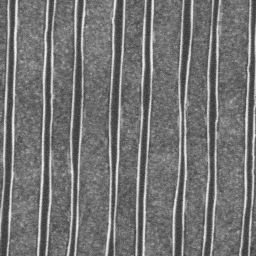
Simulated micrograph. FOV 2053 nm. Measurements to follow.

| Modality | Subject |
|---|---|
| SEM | parallel lines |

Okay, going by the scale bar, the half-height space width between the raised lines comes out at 0.229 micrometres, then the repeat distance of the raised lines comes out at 0.273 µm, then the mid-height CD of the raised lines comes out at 66.1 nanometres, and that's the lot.